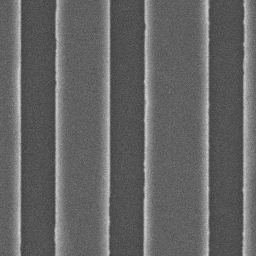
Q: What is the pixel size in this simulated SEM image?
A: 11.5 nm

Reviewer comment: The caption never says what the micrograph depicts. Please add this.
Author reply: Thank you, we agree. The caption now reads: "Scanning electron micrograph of lines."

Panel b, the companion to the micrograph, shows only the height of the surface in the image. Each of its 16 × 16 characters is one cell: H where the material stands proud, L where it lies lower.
HLLLHHHLLHHHHLLH
HLLLHHHLLHHHHLLH
HLLLHHHLLHHHHLLH
HLLLHHHLLHHHHLLH
HLLLHHHLLHHHHLLH
HLLLHHHLLHHHHLLH
HLLLHHHLLHHHHLLH
HLLLHHHLLHHHHLLH
HLLLHHHLLHHHHLLH
HLLLHHHLLHHHHLLH
HLLLHHHLLHHHHLLH
HLLLHHHLLHHHHLLH
HLLLHHHLLHHHHLLH
HLLLHHHLLHHHHLLH
HLLLHHHLLHHHHLLH
HLLLHHHLLHHHHLLH